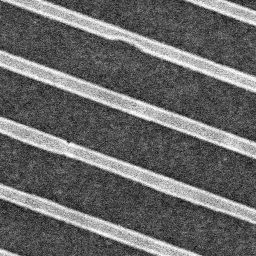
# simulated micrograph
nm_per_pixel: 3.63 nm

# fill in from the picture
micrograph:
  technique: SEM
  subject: one or a few lines or trenches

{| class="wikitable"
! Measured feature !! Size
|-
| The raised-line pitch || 62.3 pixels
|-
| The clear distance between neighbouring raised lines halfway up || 184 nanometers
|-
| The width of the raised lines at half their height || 40.6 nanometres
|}